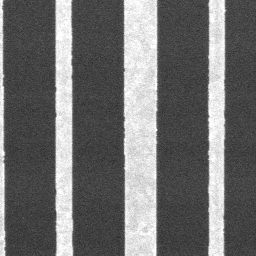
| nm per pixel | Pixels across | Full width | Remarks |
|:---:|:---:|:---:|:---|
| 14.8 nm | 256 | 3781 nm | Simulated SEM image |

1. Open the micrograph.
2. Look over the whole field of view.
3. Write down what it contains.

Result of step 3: lines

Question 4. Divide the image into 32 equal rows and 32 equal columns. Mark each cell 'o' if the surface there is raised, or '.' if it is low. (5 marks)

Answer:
.......oo.......oooo......oo....
.......oo.......oooo......oo....
.......oo.......oooo......oo....
.......oo.......oooo......oo....
.......oo.......oooo......oo....
.......oo.......oooo......oo....
.......oo.......oooo......oo....
.......oo.......oooo......oo....
.......oo.......oooo......oo....
.......oo.......oooo......oo....
.......oo.......oooo......oo....
.......oo.......oooo......oo....
.......oo.......oooo......oo....
.......oo.......ooo.......oo....
.......oo.......ooo.......oo....
.......oo.......ooo.......oo....
.......oo.......oooo......oo....
.......oo.......ooo.......oo....
.......oo.......ooo.......oo....
.......oo.......ooo.......oo....
.......oo.......ooo.......oo....
.......oo.......ooo.......oo....
.......oo.......ooo.......oo....
.......oo.......ooo.......oo....
.......oo.......ooo.......oo....
.......oo.......ooo.......oo....
.......oo.......ooo.......oo....
.......oo.......ooo.......oo....
o......oo.......ooo.......oo....
o......oo.......ooo.......oo....
o......oo.......ooo.......oo....
o......oo.......ooo.......oo....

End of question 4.